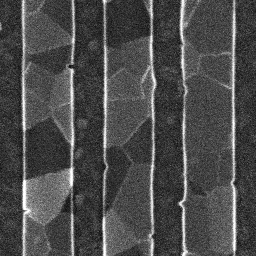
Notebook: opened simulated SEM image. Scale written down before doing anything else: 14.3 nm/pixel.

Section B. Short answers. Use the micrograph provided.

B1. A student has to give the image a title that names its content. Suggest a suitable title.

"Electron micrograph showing one or a few lines or trenches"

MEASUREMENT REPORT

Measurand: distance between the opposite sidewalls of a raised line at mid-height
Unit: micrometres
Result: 0.699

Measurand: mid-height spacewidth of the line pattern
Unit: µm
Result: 0.454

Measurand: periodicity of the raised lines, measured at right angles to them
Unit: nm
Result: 1150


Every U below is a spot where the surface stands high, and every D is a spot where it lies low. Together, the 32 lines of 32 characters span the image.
DDDUUUUUUDDDDUUUUUUDDDDUUUUUUDDD
DDDUUUUUUDDDDUUUUUUDDDDUUUUUUDDD
DDDUUUUUUDDDDUUUUUUDDDDUUUUUUDDD
DDDUUUUUUDDDDUUUUUUDDDDUUUUUUDDD
DDDUUUUUUDDDDUUUUUUDDDDUUUUUUDDD
DDDUUUUUUDDDDUUUUUUDDDDUUUUUUDDD
DDDUUUUUUDDDDUUUUUUDDDDUUUUUUDDD
DDDUUUUUUDDDDUUUUUUDDDDUUUUUUDDD
DDDUUUUUUDDDDUUUUUUDDDDUUUUUUDDD
DDDUUUUUUDDDDUUUUUUDDDDUUUUUUDDD
DDDUUUUUUDDDDUUUUUUDDDDUUUUUUDDD
DDDUUUUUUDDDDUUUUUUDDDDUUUUUUDDD
DDDUUUUUUDDDDUUUUUUDDDDUUUUUUDDD
DDDUUUUUUDDDDUUUUUUDDDDUUUUUUDDD
DDDUUUUUUDDDDUUUUUUDDDDUUUUUUDDD
DDDUUUUUUDDDDUUUUUUDDDDUUUUUUDDD
DDDUUUUUUDDDDUUUUUUDDDDUUUUUUDDD
DDDUUUUUUDDDDUUUUUUDDDDUUUUUUDDD
DDDUUUUUUDDDDUUUUUUDDDDUUUUUUDDD
DDDUUUUUUDDDDUUUUUUDDDDUUUUUUDDD
DDDUUUUUUDDDDUUUUUUDDDDUUUUUUDDD
DDDUUUUUUDDDDUUUUUUDDDDUUUUUUDDD
DDDUUUUUUDDDDUUUUUUDDDDUUUUUUDDD
DDDUUUUUUDDDDUUUUUUDDDDUUUUUUDDD
DDDUUUUUUDDDDUUUUUUDDDDUUUUUUDDD
DDDUUUUUUDDDDUUUUUUDDDDUUUUUUDDD
DDDUUUUUUDDDDUUUUUUDDDDUUUUUUDDD
DDDUUUUUUDDDDUUUUUUDDDDUUUUUUDDD
DDDUUUUUUDDDDUUUUUUDDDDUUUUUUDDD
DDDUUUUUUDDDDUUUUUUDDDDUUUUUUDDD
DDDUUUUUUDDDDUUUUUUDDDDUUUUUUDDD
DDDUUUUUUDDDDUUUUUUDDDDUUUUUUDDD